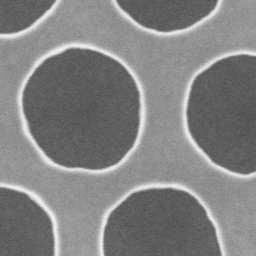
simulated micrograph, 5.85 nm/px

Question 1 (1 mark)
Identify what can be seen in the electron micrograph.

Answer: holes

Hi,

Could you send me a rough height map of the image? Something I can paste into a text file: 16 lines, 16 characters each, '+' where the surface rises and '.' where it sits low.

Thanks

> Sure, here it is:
...+++++.....+++
..+++++++...++++
++++++++++++++++
+++....+++++++..
++......+++++...
+........+++....
+........+++....
++.......+++....
++.......+++....
+++.....+++++...
+++++..+++++++..
++++++++++++++++
..++++++....++++
...++++......+++
...+++........++
...+++........++